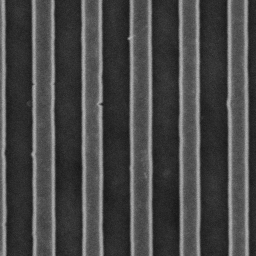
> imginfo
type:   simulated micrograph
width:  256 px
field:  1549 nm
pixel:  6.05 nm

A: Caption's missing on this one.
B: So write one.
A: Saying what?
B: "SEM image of parallel lines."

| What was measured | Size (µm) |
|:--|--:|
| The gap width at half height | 0.178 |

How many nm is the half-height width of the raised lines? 110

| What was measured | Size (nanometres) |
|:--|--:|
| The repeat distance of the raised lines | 294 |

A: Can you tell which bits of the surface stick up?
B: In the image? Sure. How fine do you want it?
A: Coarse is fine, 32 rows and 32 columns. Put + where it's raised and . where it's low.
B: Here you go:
....+++...+++...+++....++....++.
....+++...+++...+++....++....++.
....+++...+++...+++....++....++.
....+++...+++...+++....++....++.
....+++...+++...+++....++....++.
....+++...+++...+++....++....++.
+...+++...+++...+++....++....++.
+...+++...+++...+++....++....++.
+...+++...+++...+++....++....++.
+...+++...+++...+++....++....++.
+...+++...+++...+++....++....++.
....+++...+++...+++....++....++.
+...+++...+++...+++....++....++.
+...+++...+++...+++....++....++.
+...+++...+++...+++....++....++.
+...+++...+++...+++....++....++.
+...+++...+++...+++....++....++.
+...+++...+++...+++....++....++.
+...+++...+++....++....++....++.
....+++...+++....++....++....++.
+...+++...+++...+++....++....++.
....+++....++...+++....++....++.
....+++...+++....++....++....++.
+...+++...+++...+++....++....++.
+...+++...+++....++....++....++.
+...+++...+++....++....++....++.
+...+++...+++....++....++....++.
+...+++....++....++....++....++.
+...+++....++....++....++....++.
+...+++...+++....++....++....++.
+...+++...+++....++....++....++.
+...+++...+++....++....++....++.